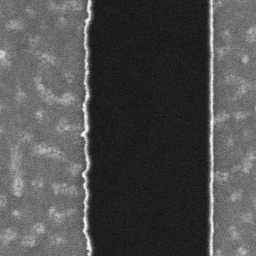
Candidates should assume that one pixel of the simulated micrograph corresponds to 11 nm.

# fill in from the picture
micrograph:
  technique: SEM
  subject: one or a few lines or trenches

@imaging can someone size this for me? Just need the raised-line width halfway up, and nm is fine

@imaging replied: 1390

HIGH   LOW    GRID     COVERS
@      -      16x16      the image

------@@@@@@@---
-----@@@@@@@@---
-----@@@@@@@@---
-----@@@@@@@@---
-----@@@@@@@@---
-----@@@@@@@@---
-----@@@@@@@@---
-----@@@@@@@@---
-----@@@@@@@@---
-----@@@@@@@@---
-----@@@@@@@@---
-----@@@@@@@@---
-----@@@@@@@@---
-----@@@@@@@@---
-----@@@@@@@@---
-----@@@@@@@@---